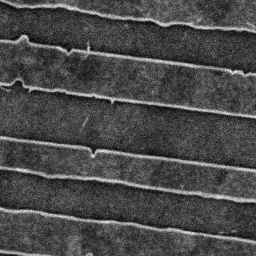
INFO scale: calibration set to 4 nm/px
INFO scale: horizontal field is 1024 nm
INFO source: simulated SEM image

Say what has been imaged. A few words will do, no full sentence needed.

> one or a few lines or trenches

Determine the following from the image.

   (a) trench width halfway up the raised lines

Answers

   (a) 0.163 micrometres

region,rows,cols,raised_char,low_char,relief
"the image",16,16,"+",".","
....++++++++++++
..........++++++
.+..............
+++++++.........
+++++++++++++++.
..++++++++++++++
..........++++++
................
................
+++++++.........
+++++++++++++++.
........++++++++
...............+
++++............
++++++++++++....
++++++++++++++++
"